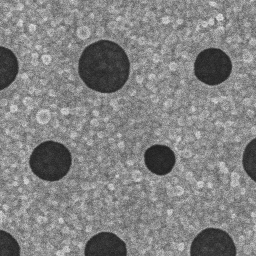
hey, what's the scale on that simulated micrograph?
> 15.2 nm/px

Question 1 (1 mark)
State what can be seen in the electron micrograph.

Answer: holes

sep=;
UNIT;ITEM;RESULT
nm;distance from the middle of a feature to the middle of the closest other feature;1650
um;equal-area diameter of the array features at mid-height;0.605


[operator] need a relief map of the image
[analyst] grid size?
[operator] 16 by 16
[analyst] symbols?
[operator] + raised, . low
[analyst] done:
++++++++++++++++
++++++++++++++++
++++++++++++++++
.++++...++++..++
.++++...++++..++
++++++..++++++++
++++++++++++++++
++++++++++++++++
++++++++++++++++
++..+++++..++++.
++..+++++..++++.
++++++++++++++++
++++++++++++++++
++++++++++++++++
+++++++++++++.++
.++++...++++...+